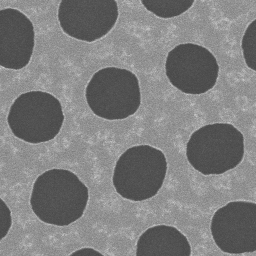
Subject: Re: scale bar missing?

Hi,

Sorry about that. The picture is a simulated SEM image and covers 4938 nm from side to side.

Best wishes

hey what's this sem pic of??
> holes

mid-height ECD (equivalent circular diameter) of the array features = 1060 nanometres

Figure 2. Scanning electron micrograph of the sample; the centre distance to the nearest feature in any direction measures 1570 nanometres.